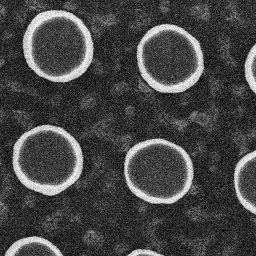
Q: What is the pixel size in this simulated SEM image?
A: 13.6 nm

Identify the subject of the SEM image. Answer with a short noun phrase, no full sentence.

raised bodies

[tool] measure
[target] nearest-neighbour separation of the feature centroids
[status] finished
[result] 1510 nanometres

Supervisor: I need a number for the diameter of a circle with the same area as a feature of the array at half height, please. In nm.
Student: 859